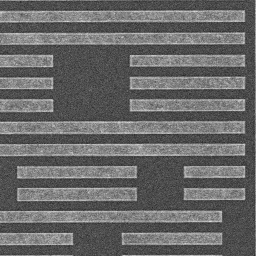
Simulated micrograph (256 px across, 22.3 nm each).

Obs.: wiring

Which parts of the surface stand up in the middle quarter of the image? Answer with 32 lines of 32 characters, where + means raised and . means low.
................................
................................
................................
................................
.................+++++++++++++++
.................+++++++++++++++
................................
................................
................................
.................+++++++++++++++
.................+++++++++++++++
................................
................................
................................
................................
++++++++++++++++++++++++++++++++
++++++++++++++++++++++++++++++++
................................
................................
................................
++++++++++++++++++++++++++++++++
++++++++++++++++++++++++++++++++
++++++++++++++++++++++++++++++++
................................
................................
................................
++++++++++++++++++............++
++++++++++++++++++............++
................................
................................
................................
++++++++++++++++++..............